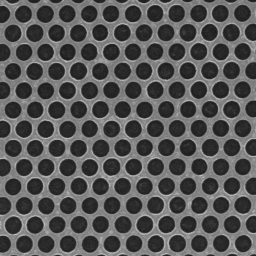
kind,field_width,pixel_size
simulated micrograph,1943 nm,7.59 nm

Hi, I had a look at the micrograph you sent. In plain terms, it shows a regular array of holes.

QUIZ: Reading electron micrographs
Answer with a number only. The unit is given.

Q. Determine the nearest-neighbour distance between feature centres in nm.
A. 164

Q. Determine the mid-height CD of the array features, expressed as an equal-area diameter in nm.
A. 129